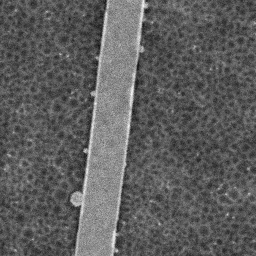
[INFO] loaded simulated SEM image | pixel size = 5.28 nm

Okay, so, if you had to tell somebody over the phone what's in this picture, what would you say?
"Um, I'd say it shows one or a few lines or trenches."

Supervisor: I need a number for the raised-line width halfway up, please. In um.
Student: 0.196